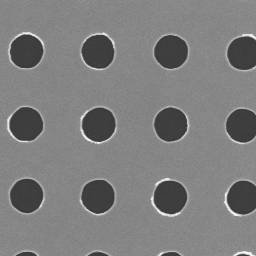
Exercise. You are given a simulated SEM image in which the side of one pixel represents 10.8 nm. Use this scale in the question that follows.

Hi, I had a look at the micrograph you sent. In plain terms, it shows a regular array of holes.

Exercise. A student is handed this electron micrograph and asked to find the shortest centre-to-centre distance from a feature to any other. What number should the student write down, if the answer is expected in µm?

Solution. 0.777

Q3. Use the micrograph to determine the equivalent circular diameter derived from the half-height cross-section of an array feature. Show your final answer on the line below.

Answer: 364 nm